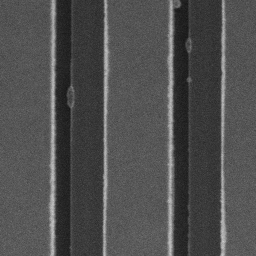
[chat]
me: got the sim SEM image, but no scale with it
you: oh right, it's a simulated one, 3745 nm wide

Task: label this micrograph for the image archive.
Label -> lines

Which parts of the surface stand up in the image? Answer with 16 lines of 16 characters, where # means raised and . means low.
###....####...##
###....####...##
###....####...##
###....####...##
###....####...##
###....####...##
###....####...##
###....####...##
###....####...##
###....####...##
###...#####...##
###...#####...##
###...#####...##
###...#####...##
###...#####...##
###...#####...##